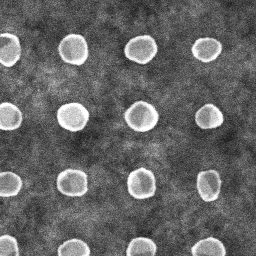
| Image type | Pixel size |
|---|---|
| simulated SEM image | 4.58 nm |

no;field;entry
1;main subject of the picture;a regular array of raised bodies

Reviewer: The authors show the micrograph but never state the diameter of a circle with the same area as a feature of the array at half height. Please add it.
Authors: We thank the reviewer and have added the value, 125 nanometres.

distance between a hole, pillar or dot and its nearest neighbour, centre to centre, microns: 0.307